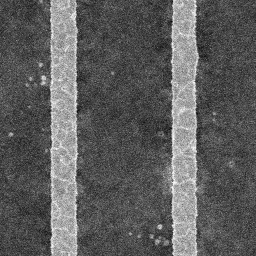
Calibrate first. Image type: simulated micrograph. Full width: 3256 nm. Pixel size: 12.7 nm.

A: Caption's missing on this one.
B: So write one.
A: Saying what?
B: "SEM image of one or a few lines or trenches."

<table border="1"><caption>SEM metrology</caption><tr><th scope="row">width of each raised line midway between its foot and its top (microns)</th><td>0.297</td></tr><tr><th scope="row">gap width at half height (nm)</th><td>1220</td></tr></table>